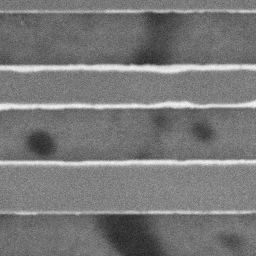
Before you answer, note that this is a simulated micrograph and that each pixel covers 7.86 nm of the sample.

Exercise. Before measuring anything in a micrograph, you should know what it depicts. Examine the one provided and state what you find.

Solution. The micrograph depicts lines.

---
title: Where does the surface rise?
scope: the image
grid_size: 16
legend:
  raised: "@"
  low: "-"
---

@@@@@@@@@@@@@@@@
----------------
----------------
----------------
@@@@@@@@@@@@@@@@
@@@@@@@@@@@@@@@@
@@@@@@@@@@@@@@@@
----------------
----------------
----------------
@@@@@@@@@@@@@@@@
@@@@@@@@@@@@@@@@
@@@@@@@@@@@@@@@@
----------------
----------------
----------------